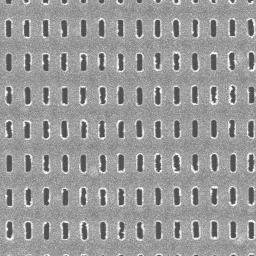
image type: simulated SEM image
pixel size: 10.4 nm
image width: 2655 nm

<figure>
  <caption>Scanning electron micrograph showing a regular array of holes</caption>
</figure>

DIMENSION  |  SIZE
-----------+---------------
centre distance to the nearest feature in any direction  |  189 nanometers